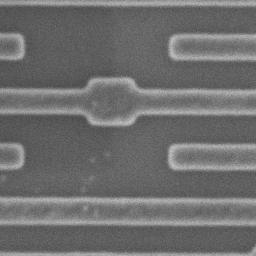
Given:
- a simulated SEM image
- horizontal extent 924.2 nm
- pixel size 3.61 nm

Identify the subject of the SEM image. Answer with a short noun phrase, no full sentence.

wiring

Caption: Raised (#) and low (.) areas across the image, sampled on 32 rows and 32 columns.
################################
................................
................................
................................
##....................##########
###..................###########
###..................###########
................................
................................
................................
...........######...............
################################
################################
################################
...........######...............
............####................
................................
................................
###..................###########
###..................###########
###..................###########
................................
................................
................................
................................
################################
################################
################################
................................
................................
................................
...............................#